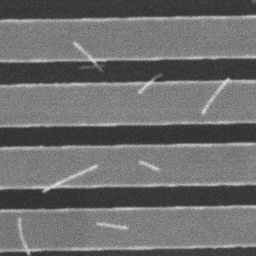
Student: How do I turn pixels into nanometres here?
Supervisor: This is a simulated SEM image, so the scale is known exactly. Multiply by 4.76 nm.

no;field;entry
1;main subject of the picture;lines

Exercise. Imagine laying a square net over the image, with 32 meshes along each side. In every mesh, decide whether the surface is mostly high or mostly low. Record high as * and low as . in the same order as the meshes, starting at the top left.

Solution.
................................
................................
********************************
********************************
********************************
********************************
********************************
**************..................
................................
................................
.....***************************
********************************
********************************
********************************
********************************
**********************..........
................................
................................
********************************
********************************
********************************
********************************
********************************
*******.........................
................................
................................
********************************
********************************
********************************
********************************
********************************
...*............................